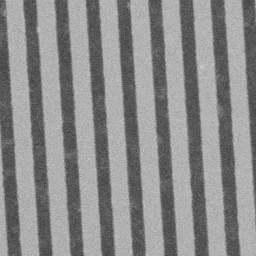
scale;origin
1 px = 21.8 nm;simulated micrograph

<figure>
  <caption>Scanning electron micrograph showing parallel lines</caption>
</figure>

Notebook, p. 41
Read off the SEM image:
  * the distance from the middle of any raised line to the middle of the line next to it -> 0.679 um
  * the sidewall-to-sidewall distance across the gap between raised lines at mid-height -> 315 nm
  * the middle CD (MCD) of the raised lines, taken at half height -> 367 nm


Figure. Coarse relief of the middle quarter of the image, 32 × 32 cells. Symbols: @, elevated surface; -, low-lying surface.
--@@@@----@@@@----@@@@----@@@@--
--@@@@----@@@@----@@@@----@@@@--
--@@@@----@@@@----@@@@----@@@@--
--@@@@@---@@@@----@@@@----@@@@--
--@@@@@---@@@@----@@@@----@@@@--
--@@@@----@@@@----@@@@----@@@@--
---@@@@---@@@@----@@@@----@@@@--
---@@@@---@@@@----@@@@----@@@@--
---@@@@----@@@@---@@@@----@@@@--
---@@@@---@@@@@---@@@@----@@@@--
---@@@@---@@@@@---@@@@@---@@@@--
---@@@@----@@@@---@@@@@---@@@@--
---@@@@----@@@@---@@@@@---@@@@@-
---@@@@----@@@@----@@@@---@@@@--
---@@@@----@@@@----@@@@---@@@@--
---@@@@----@@@@----@@@@----@@@@-
---@@@@----@@@@----@@@@----@@@@-
---@@@@----@@@@----@@@@----@@@@-
---@@@@----@@@@----@@@@----@@@@-
---@@@@----@@@@----@@@@----@@@@-
----@@@@---@@@@----@@@@----@@@@-
----@@@----@@@@----@@@@----@@@@-
----@@@@---@@@@----@@@@----@@@@-
----@@@@---@@@@----@@@@----@@@@-
----@@@@----@@@@---@@@@----@@@@-
----@@@@----@@@@---@@@@----@@@@-
----@@@@----@@@@---@@@@@---@@@@-
----@@@@----@@@@---@@@@@---@@@@-
----@@@@----@@@@---@@@@@---@@@@-
----@@@@----@@@@----@@@@---@@@@-
----@@@@----@@@@----@@@@---@@@@-
@---@@@@----@@@@----@@@@----@@@@